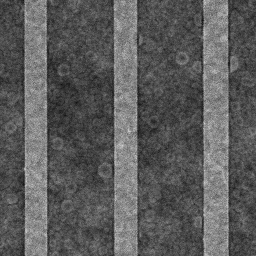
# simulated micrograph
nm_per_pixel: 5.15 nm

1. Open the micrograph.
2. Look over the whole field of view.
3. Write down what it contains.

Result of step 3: one or a few lines or trenches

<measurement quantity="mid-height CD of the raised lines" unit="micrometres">0.116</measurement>